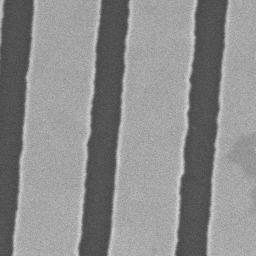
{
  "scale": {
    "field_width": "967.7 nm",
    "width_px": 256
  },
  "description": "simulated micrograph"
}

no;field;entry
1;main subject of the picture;lines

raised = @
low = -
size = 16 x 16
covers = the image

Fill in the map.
--@@@@--@@@@--@@
--@@@@--@@@@--@@
--@@@@--@@@@--@@
--@@@@--@@@@--@@
--@@@@--@@@@--@@
--@@@@--@@@@--@@
--@@@@--@@@@--@@
--@@@@--@@@@--@@
-@@@@@-@@@@@--@@
-@@@@--@@@@--@@@
-@@@@--@@@@--@@@
-@@@@--@@@@--@@@
-@@@@--@@@@--@@@
-@@@@--@@@@--@@@
-@@@@--@@@@--@@@
-@@@@--@@@@--@@@